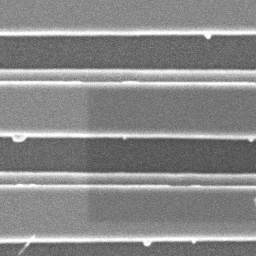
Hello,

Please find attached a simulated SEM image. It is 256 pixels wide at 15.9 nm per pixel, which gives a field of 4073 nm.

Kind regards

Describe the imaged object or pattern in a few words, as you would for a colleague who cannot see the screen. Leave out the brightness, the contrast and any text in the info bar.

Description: lines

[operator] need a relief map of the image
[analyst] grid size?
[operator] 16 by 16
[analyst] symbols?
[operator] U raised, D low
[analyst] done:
UUUUUUUUUUUUUUUU
UUUUUUUUUUUUUUUU
DDDDDDDDDDDDDDDD
DDDDDDDDDDDDDDDD
UUUUUUUUUUUDDUDD
UUUUUUUUUUUUUUUU
UUUUUUUUUUUUUUUU
UUUUUUUUUUUUUUUU
UUDDDDDUDDDUUUUU
DDDDDDDDDDDDDDDD
DDDDDDDDDDDDDDDD
UUUUUUUUUUUUUUUU
UUUUUUUUUUUUUUUU
UUUUUUUUUUUUUUUU
UUUUUUUUUUUUUUUU
DDDDDDDDDDDDDDDD